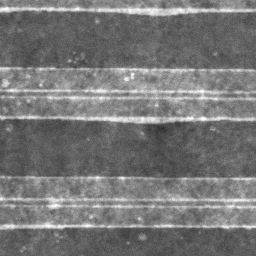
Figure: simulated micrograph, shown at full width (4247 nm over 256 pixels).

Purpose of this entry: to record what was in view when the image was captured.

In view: lines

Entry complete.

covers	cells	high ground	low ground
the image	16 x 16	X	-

XXXXXXXXXXXXXXXX
----------------
----------------
----------------
XXXXXXXXXXXXXXXX
XXXXXXXXXXXXXXXX
XXXXXXXXXXXXXXXX
--------XXX-----
----------------
----------------
----------------
XXXXXXXXXXXXXXXX
XXXXXXXXXXXXXXXX
XXXXXXXXXXXXXXXX
----------------
----------------